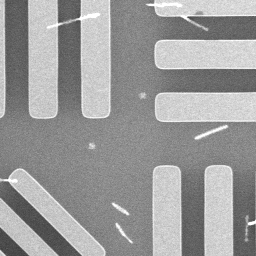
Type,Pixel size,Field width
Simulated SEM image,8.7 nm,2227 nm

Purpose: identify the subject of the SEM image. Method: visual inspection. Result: groups of lines, slits or small figures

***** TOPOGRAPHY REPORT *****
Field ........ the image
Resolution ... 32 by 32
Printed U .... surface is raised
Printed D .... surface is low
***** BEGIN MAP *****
UDDDUUUDDDUUUUDDDDDUUUUUUUUUUUUU
UDDDUUUDDDUUUUDDDDDDUUUUUUUUUUUU
UDDDUUUDDDUUUUDDDDDDDDDDDDDDDDDD
UDDDUUUDDDUUUUDDDDDDDDDDDDDDDDDD
UDDDUUUDDDUUUUDDDDDDDDDDDDDDDDDD
UDDDUUUDDDUUUUDDDDDDUUUUUUUUUUUU
UDDDUUUDDDUUUUDDDDDUUUUUUUUUUUUU
UDDDUUUDDDUUUUDDDDDUUUUUUUUUUUUU
UDDDUUUDDDUUUUDDDDDDUUUUDDDDDDDD
UDDDUUUDDDUUUUDDDDDDDDDDDDDDDDDD
UDDDUUUDDDUUUUDDDDDDDDDDDDDDDDDD
UDDDUUUDDDUUUUDDDDDDDDDDDDDDDDDD
UDDDUUUDDDUUUUDDDDDUUUUUUUUUUUUU
UDDDUUUDDDUUUUDDDDDUUUUUUUUUUUUU
DDDDUUUDDDDUUDDDDDDDUUUUUUUUUUUU
DDDDDDDDDDDDDDDDDDDDDDDDDDDDDDDD
DDDDDDDDDDDDDDDDDDDDDDDDDDDDDDDD
DDDDDDDDDDDDDDDDDDDDDDDDDDDDDDDD
DDDDDDDDDDDDDDDDDDDDDDDDDDDDDDDD
DDDDDDDDDDDDDDDDDDDDDDDDDDDDDDDD
DDDDDDDDDDDDDDDDDDDDDDDDDDDDDDDD
DDUDDDDDDDDDDDDDDDDUUUUDDDUUUDDD
DUUUDDDDDDDDDDDDDDDUUUUDDDUUUDDD
DDUUUDDDDDDDDDDDDDDUUUUDDDUUUDDD
DDDUUUDDDDDDDDDDDDDUUUUDDDUUUDDD
UDDDUUUDDDDDDDDDDDDUUUUDDDUUUDDD
UUDDDUUUDDDDDDDDDDDUUUUDDDUUUDDD
UUUDDDUUUDDDDDDDDDDUUUUDDDUUUDDD
UUUUDDDUUUDDDDDDDDDUUUUDDDUUUDDD
DUUUUDDDUUUDDDDDDDDUUUUDDDUUUDDD
DDUUUUDDDUUUDDDDDDDUUUUDDDUUUDDD
DDDUUUUDDDUUUDDDDDDUUUUDDDUUUDDD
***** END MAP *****